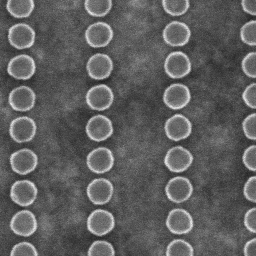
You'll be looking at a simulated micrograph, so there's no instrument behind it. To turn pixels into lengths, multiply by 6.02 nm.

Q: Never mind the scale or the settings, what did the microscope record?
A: a regular array of raised bodies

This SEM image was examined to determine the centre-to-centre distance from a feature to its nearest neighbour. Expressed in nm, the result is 187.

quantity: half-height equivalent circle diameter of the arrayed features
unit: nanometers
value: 151